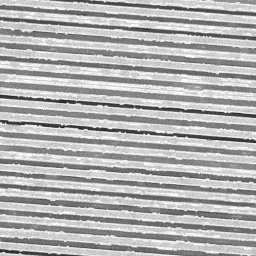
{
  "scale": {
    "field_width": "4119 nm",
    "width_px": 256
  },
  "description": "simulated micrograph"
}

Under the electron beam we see parallel lines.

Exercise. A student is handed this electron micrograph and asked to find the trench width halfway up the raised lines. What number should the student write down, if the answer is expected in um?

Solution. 0.0962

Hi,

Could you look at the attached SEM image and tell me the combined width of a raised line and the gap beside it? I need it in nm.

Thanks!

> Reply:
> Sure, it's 206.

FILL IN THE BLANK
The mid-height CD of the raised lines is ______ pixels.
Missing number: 6.98